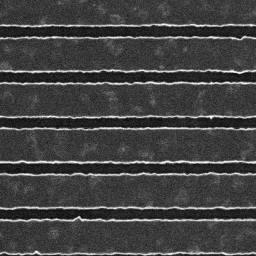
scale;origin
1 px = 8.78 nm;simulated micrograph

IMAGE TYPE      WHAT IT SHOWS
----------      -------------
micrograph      parallel lines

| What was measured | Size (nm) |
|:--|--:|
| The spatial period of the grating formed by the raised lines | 400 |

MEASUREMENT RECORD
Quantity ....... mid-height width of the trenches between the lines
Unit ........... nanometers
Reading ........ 104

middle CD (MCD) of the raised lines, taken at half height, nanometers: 298